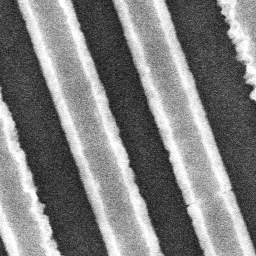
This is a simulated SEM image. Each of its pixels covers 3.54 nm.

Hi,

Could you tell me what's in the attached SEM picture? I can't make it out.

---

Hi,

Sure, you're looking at one or a few lines or trenches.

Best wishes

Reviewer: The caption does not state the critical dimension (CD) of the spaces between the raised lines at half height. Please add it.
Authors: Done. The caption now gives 182 nm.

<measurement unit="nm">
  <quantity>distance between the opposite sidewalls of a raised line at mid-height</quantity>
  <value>140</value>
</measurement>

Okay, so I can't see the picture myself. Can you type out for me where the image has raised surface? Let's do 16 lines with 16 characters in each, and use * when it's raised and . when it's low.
..**....**....**
..***...**....**
..***...***....*
...**....**....*
...***...***....
...***...***....
....**....**....
....***...***...
*...***...***...
*....***...**...
**...***...***..
**....**...***..
**....***...**..
***...***...***.
***....**....**.
.**....***...**.